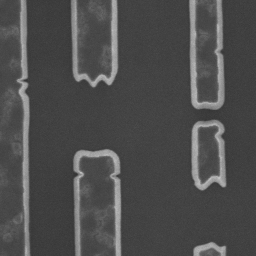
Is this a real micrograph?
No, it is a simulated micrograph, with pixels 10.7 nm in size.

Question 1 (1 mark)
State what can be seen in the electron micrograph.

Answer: one or a few lines or trenches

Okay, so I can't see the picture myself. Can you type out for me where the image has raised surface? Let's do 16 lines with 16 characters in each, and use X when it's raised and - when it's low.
X----XX-----XX--
X----XX-----XX--
X----XX-----XX--
XX---XX-----XX--
XX---XX-----XX--
X-----------XX--
XX----------XX--
XX--------------
XX----------XX--
XX----------XX--
XX---XX-----XX--
XX---XX---------
XX---XX---------
XX---XX---------
XX---XX---------
XX---XX------X--